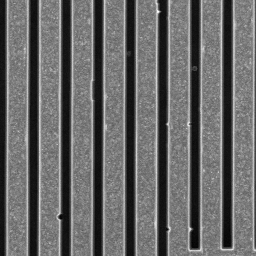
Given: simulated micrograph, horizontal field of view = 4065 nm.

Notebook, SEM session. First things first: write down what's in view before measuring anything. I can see parallel lines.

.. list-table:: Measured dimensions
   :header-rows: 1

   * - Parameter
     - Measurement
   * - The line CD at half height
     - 353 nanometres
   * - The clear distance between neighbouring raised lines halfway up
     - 153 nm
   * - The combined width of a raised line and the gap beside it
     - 513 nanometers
